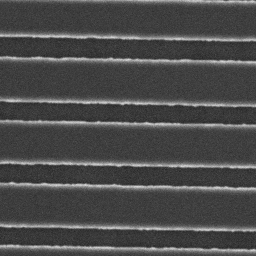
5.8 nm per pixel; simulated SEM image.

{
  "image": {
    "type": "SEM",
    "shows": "lines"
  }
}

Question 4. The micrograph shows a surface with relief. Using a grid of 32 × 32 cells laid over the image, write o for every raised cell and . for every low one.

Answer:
oooooooooooooooooooooooooooooooo
oooooooooooooooooooooooooooooooo
oooooooooooooooooooooooooooooooo
oooooooooooooooooooooooooooooooo
oooooooooooooooooooooooooooooooo
................................
................................
ooooooooooooooooo...............
oooooooooooooooooooooooooooooooo
oooooooooooooooooooooooooooooooo
oooooooooooooooooooooooooooooooo
oooooooooooooooooooooooooooooooo
oooooooooooooooooooooooooooooooo
................................
................................
ooooooooooooooooooooooo.........
oooooooooooooooooooooooooooooooo
oooooooooooooooooooooooooooooooo
oooooooooooooooooooooooooooooooo
oooooooooooooooooooooooooooooooo
..oooooooooooooooooooooooooooooo
................................
................................
ooooooooooooooooooooooooooooo...
oooooooooooooooooooooooooooooooo
oooooooooooooooooooooooooooooooo
oooooooooooooooooooooooooooooooo
oooooooooooooooooooooooooooooooo
............oooooooooooooooooooo
................................
................................
oooooooooooooooooooooooooooooooo